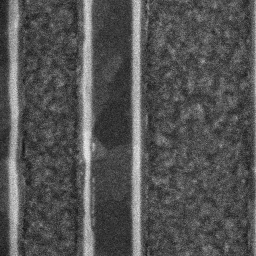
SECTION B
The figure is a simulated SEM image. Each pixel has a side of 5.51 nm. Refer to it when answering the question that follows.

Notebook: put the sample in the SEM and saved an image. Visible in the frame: one or a few lines or trenches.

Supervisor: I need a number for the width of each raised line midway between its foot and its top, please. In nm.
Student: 280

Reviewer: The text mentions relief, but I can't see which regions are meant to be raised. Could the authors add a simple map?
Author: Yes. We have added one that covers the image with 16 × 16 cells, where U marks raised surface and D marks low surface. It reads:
UDDDDUUUUDDDDDDD
UDDDDDUUUDDDDDDD
UDDDDUUUUDDDDDDD
UDDDDUUUUDDDDDDD
UDDDDUUUUDDDDDDD
UDDDDUUUUDDDDDDD
UDDDDUUUUDDDDDDD
UDDDDUUUUDDDDDDD
UDDDDUUUUDDDDDDD
UDDDDUUUUDDDDDDD
UDDDDUUUUDDDDDDD
UDDDDUUUUDDDDDDD
UDDDDUUUUDDDDDDD
UDDDDUUUUDDDDDDD
UDDDDUUUUDDDDDDD
UDDDDUUUUDDDDDDD